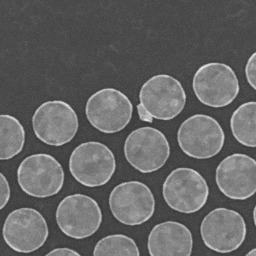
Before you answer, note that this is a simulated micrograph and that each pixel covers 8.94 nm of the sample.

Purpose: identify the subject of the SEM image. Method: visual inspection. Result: a regular array of raised bodies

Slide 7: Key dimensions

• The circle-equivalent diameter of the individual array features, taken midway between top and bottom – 0.394 micrometres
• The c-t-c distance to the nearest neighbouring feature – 482 nm